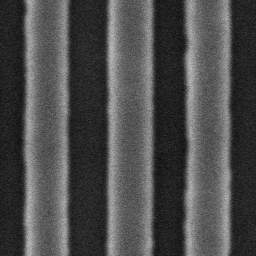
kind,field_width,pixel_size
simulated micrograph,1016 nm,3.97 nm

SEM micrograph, lines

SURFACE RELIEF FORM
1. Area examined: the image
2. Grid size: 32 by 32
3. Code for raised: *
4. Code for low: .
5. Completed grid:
...*****......*****....******...
...*****......*****....******...
...*****......*****....******...
...*****......*****....******...
...*****......*****.....*****...
...*****......*****.....*****...
...*****......*****.....*****...
...*****......*****....******...
...*****......*****....******...
...*****......*****.....*****...
....****......*****.....*****...
...*****......*****.....*****...
...*****......*****.....*****...
...*****......*****.....*****...
...*****......*****.....*****...
...*****......*****....******...
...*****......*****.....*****...
...*****......*****.....*****...
...*****......*****.....*****...
...*****......*****.....*****...
...*****......*****.....*****...
...*****......*****....******...
...*****......*****.....*****...
...*****......*****.....*****...
...*****......*****....******...
...*****......*****....******...
...*****......*****....******...
...*****......*****....******...
...*****......*****....******...
...*****......*****....******...
...*****......*****....******...
...*****......*****....******...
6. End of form